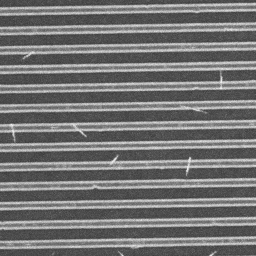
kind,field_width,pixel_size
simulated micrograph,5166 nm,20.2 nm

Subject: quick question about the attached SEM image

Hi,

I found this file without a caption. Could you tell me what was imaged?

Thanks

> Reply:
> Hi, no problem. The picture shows parallel lines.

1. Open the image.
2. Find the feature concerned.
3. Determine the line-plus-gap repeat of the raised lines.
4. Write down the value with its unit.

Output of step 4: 0.393 µm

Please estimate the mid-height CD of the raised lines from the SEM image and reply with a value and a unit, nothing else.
121 nanometres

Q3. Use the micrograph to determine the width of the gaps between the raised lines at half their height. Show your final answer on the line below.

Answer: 275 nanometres